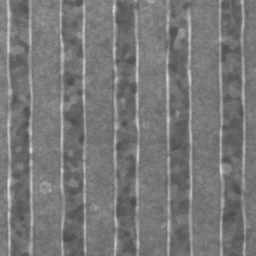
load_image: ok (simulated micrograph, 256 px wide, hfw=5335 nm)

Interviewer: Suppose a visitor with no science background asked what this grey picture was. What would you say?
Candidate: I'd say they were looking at wiring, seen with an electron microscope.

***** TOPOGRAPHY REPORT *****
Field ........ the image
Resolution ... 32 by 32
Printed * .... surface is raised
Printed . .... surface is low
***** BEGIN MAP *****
.***....***...***....***....**..
.***....***...***....***...***..
.***....***...***....***...***..
.***....**....***....***...***..
.***....**....***....***...***..
.***....**....***....***....**..
.***....***...***....***....**..
.***....***...***....***....**..
.***....***...***....***....**..
.***....**.....**....***....**..
.***....**....***....***....**..
.***....**....***....***....**..
.***....***...***....***....**..
.***....***...***....***....**..
.***....***....**....***....**..
.***....***....**....***....**..
.***....***...***....***....**..
.***....***...***....***....**..
.***....***...***....***....**..
.***....***...***....***....**..
.***....***...***....***....**..
.***....***...***....***....**..
.***....***...***....***....**..
.***....***....**....***....**..
.***....***....**....***....**..
.***....***...***....***....**..
.***....***...***....***....**..
.***....***...***....***....***.
.***....***....**....***....***.
.***....***....**....***....***.
.***....***...***....***....***.
.***....***...***....***....**..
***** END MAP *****